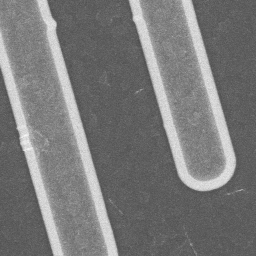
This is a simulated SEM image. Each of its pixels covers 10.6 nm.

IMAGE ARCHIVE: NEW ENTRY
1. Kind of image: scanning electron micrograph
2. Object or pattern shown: one or a few lines or trenches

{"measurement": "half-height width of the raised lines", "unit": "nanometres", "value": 561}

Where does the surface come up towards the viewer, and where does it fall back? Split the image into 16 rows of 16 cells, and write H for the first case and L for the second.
HHHLLLLLHHHHLLLL
HHHLLLLLLHHHLLLL
HHHLLLLLLHHHLLLL
HHHHLLLLLHHHHLLL
HHHHLLLLLLHHHLLL
LHHHLLLLLLHHHLLL
LHHHHLLLLLHHHHLL
LHHHHLLLLLHHHHLL
LHHHHLLLLLLHHHLL
LLHHHLLLLLLHHHLL
LLHHHHLLLLLHHHLL
LLHHHHLLLLLLHLLL
LLLHHHLLLLLLLLLL
LLLHHHLLLLLLLLLL
LLLHHHHLLLLLLLLL
LLLHHHHLLLLLLLLL